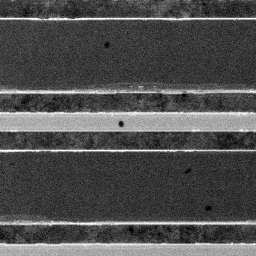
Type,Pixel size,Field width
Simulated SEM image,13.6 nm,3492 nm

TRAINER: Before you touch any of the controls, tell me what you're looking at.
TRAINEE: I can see lines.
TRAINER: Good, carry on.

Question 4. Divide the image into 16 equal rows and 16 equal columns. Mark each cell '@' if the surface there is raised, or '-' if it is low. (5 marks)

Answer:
----------------
@@@@@@@@@@@@@@@@
@@@@@@@@@@@@@@@@
@@@@@@@@@@@@@@@@
@@@@@@@@@@@@@@@@
@@@@@@@@@@@@@@@@
----------------
----------------
----------------
@@@@@@@@@@@@@@@@
@@@@@@@@@@@@@@@@
@@@@@@@@@@@@@@@@
@@@@@@@@@@@@@@@@
@@@@@@@@@@@@@@@@
----------------
----------------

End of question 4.